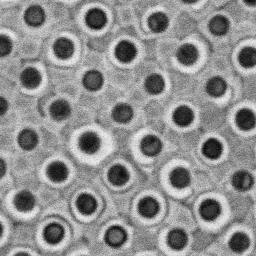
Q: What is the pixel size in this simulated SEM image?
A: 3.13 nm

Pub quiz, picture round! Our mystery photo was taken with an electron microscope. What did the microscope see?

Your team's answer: a regular array of holes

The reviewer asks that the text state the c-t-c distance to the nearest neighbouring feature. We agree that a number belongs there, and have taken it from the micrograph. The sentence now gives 136 nm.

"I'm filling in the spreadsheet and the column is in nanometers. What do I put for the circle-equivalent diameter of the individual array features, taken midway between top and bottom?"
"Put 68.5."